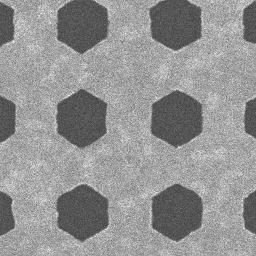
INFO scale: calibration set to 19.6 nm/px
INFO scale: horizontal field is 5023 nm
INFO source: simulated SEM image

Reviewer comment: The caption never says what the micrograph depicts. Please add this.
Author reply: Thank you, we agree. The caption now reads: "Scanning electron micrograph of holes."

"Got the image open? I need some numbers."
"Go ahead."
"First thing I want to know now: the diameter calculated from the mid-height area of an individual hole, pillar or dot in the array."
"1050 nm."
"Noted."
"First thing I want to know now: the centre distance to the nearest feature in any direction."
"1.84 micrometres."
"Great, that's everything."